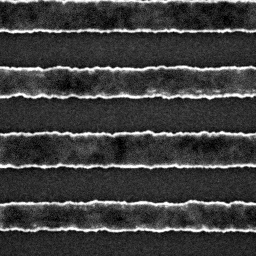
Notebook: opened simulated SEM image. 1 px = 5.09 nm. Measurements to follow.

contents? lines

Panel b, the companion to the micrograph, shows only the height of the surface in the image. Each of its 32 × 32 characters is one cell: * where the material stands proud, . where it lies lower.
********************************
********************************
********************************
********************************
................................
................................
................................
................................
*.....***...**....******...*****
********************************
********************************
********************************
................................
................................
................................
................................
..................*.............
********************************
********************************
********************************
********************************
................................
................................
................................
................................
********************************
********************************
********************************
********************************
................................
................................
................................